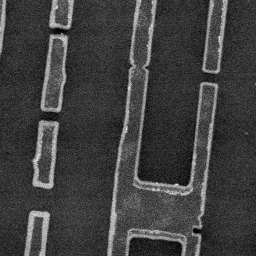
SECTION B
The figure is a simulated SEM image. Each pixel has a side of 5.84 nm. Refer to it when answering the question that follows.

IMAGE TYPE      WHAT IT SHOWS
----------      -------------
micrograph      one or a few lines or trenches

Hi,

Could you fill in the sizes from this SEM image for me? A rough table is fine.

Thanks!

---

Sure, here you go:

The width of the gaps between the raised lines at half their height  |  332 nm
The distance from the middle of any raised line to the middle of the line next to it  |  451 nm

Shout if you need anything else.